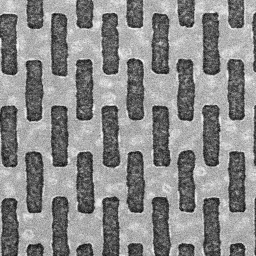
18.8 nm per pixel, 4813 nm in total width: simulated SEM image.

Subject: a regular array of holes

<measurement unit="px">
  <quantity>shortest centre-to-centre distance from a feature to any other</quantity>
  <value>50.5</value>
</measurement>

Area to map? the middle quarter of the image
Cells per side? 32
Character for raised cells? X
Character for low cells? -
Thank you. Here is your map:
-XX----XX-----XX----XX----XX----
-XX----XX-----XX----XX----XX----
-XX----XXX---XXX----XXX---XX----
XXX----XXXXXXXXX----XXXXXXXX----
XXX----XXXXXXXXX----XXXXXXXXX---
XXX----XXXXXXXXX----XXXXXXXXX---
XXX----XXXXXXXXX----XXXXXXXX----
XXX----XXXXXXXXX----XXXXXXXX----
XXX----XXXXXXXXX----XXXXXXXX----
XXX----XXXXXXXXX----XXXXXXXX----
XXX----XXX---XX-----XX---XXX----
-XX----XX-----XX----XX----XX----
-XX----XX-----XX----XX----XX----
-XX----XX-----XX----XX----XX----
-XXXXXXXX-----XXXXXXXX----XXXXXX
-XXXXXXXX-----XXXXXXXX----XXXXXX
-XXXXXXXX-----XXXXXXXX----XXXXXX
-XXXXXXXX-----XXXXXXXX----XXXXXX
-XXXXXXXX-----XXXXXXXX----XXXXXX
-XXXXXXXXX----XXXXXXXX----XXXXXX
-XXXXXXXX-----XXXXXXXX----XXXXXX
-XXXXXXXX-----XXXXXXXX----XXXXX-
-XX----XX-----XX----XX-----XX---
-XX----XXX----XX----XX-----X----
-XX----XXX----XX----XX-----X----
-XX----XXX----XX----XXX---XX----
XXX-----XXXXXXX-----XXXXXXXX----
XXX----XXXXXXXXX----XXXXXXXX----
XXX----XXXXXXXXX----XXXXXXXX----
XXX-----XXXXXXX-----XXXXXXXX----
XXX-----XXXXXXXX----XXXXXXXX----
XXX-----XXXXXXXX----XXXXXXXX----